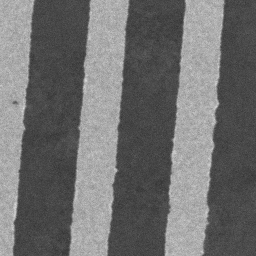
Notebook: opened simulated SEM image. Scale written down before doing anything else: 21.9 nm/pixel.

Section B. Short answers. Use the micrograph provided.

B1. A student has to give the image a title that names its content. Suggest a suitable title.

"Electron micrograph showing one or a few lines or trenches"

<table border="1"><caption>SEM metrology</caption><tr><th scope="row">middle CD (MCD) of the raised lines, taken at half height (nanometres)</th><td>780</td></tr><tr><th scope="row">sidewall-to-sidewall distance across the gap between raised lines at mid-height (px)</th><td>57.5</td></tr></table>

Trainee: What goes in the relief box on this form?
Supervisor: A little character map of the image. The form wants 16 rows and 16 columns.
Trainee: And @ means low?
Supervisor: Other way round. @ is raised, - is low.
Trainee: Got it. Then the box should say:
@@----@@----@@--
@@----@@----@@--
@@----@@---@@@--
@@---@@@---@@@--
@@---@@@---@@@--
@@---@@@---@@---
@----@@----@@---
@----@@----@@---
@----@@----@@---
@----@@----@----
@----@@----@@---
@----@@----@@---
@----@@----@@---
@----@@----@@---
@----@@---@@@---
@----@@---@@@---